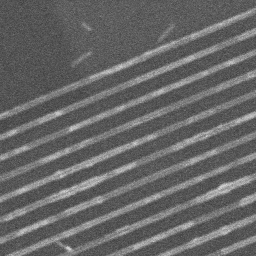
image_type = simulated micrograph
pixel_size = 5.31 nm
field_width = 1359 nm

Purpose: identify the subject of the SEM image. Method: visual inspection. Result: parallel lines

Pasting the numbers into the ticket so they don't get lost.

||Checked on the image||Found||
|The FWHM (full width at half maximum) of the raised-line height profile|24.5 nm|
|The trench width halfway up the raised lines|78.5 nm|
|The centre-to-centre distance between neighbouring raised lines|101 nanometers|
